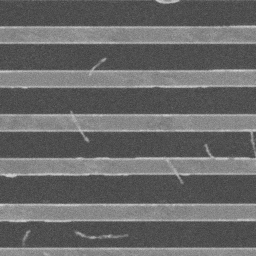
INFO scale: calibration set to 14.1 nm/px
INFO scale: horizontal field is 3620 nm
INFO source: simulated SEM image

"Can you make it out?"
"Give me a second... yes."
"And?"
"lines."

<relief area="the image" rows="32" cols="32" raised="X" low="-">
--------------------------------
--------------------------------
--------------------------------
XXXXXXXXXXXXXXXXXXXXXXXXXXXXXXXX
XXXXXXXXXXXXXXXXXXXXXXXXXXXXXXXX
--------------------------------
--------------------------------
--------------------------------
--------------------------------
XXXXXXXXXXXXXXXXXXXXXXXXXXXXXXXX
XXXXXXXXXXXXXXXXXXXXXXXXXXXXXXXX
--------------------------------
--------------------------------
--------------------------------
XXXXXXXXXXXXXXXXXXXXXXXXXXXXXXXX
XXXXXXXXXXXXXXXXXXXXXXXXXXXXXXXX
--------------------------------
--------------------------------
--------------------------------
--------------------------------
XXXXXXXXXXXXXXXXXXXXXXXXXXXXXXXX
XXXXXXXXXXXXXXXXXXXXXXXXXXXXXXXX
--------------------------------
--------------------------------
--------------------------------
--------------------------------
XXXXXXXXXXXXXXXXXXXXXXXXXXXXXXXX
XXXXXXXXXXXXXXXXXXXXXXXXXXXXXXXX
--------------------------------
--------------------------------
--------------------------------
XXXXXXXXXXXXXXXXXXXXXXXXXXXXXXXX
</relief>